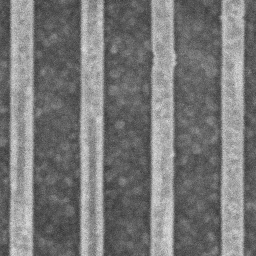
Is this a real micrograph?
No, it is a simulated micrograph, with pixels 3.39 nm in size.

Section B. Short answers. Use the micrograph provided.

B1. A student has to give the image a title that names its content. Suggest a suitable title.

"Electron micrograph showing one or a few lines or trenches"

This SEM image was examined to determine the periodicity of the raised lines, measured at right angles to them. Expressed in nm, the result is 238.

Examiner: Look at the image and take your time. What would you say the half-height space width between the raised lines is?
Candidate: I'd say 173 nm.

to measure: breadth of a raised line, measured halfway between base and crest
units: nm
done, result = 66.5